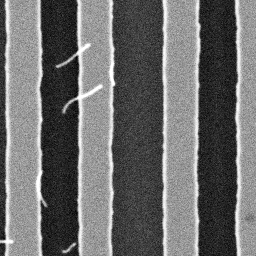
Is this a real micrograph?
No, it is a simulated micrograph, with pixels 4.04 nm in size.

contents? lines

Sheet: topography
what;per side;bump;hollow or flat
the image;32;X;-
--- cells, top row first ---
-XXXX-----XXXX------XXXXX-----XX
-XXXX-----XXXX-------XXXX-----XX
-XXXX-----XXXX-------XXXX-----XX
-XXXX-----XXXX------XXXXX-----XX
-XXXX-----XXXX-------XXXX-----XX
-XXXX-----XXXX------XXXXX-----XX
-XXXX-----XXXX------XXXXX-----XX
-XXXX-----XXXX------XXXXX-----XX
-XXXX-----XXXX------XXXXX-----XX
-XXXX-----XXXX------XXXXX-----XX
-XXXX-----XXXX------XXXXX-----XX
-XXXX-----XXXX-------XXXX-----XX
-XXXX-----XXXX-------XXXX-----XX
-XXXX-----XXXX-------XXXX-----XX
-XXXX-----XXXX-------XXXX-----XX
-XXXX-----XXXX-------XXXX-----XX
-XXXX-----XXXX------XXXXX-----XX
-XXXX-----XXXX-------XXXX-----XX
-XXXX-----XXXX------XXXXX-----XX
-XXXX-----XXXX------XXXXX-----XX
-XXXX-----XXXX------XXXXX-----XX
-XXXX-----XXXX------XXXXX-----XX
-XXXX-----XXXX------XXXXX-----XX
-XXXX-----XXXX-------XXXX-----XX
-XXXX-----XXXX------XXXXX-----XX
-XXXX-----XXXX------XXXXX-----XX
-XXXX-----XXXX------XXXXX-----XX
-XXXX-----XXXX------XXXXX-----XX
-XXXX-----XXXX------XXXXX-----XX
-XXXX-----XXXX-------XXXX-----XX
-XXXX-----XXXX-------XXXX-----XX
-XXXX-----XXXX-------XXXX-----XX